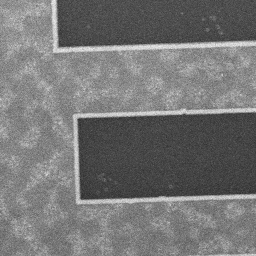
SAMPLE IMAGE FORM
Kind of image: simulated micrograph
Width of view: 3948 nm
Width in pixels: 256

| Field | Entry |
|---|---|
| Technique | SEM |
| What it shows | one or a few lines or trenches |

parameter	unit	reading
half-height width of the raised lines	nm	1010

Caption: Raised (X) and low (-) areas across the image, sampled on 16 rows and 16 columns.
XXX-------------
XXX-------------
XXX-------------
XXXXXXXXXXXXXXXX
XXXXXXXXXXXXXXXX
XXXXXXXXXXXXXXXX
XXXXXXXXXXXXXXXX
XXXXX-----------
XXXXX-----------
XXXXX-----------
XXXXX-----------
XXXXX-----------
XXXXX-----XXXXXX
XXXXXXXXXXXXXXXX
XXXXXXXXXXXXXXXX
XXXXXXXXXXXXXXXX